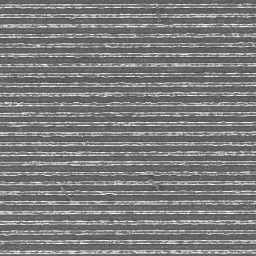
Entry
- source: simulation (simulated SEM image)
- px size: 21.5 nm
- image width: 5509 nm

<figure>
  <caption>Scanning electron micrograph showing parallel lines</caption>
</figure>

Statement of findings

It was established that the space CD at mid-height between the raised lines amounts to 142 nanometers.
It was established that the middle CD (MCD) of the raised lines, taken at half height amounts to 80.7 nanometres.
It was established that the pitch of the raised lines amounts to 212 nm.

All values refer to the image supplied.